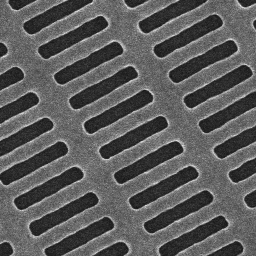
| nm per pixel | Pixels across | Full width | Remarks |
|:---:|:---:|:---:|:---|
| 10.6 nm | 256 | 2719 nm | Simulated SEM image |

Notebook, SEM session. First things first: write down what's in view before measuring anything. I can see a regular array of holes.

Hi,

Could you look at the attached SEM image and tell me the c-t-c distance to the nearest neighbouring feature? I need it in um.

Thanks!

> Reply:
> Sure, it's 0.31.